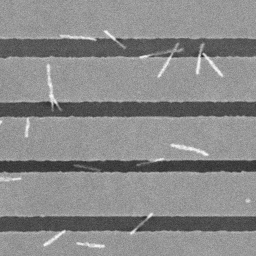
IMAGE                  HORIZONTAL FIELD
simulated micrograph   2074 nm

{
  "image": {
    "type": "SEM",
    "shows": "lines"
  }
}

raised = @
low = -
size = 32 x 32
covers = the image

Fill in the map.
@@@@@@@@@@@@@@@@@@@@@@@@@@@@@@@@
@@@@@@@@@@@@@@@@@@@@@@@@@@@@@@@@
@@@@@@@@@@@@@@@@@@@@@@@@@@@@@@@@
@@@@@@@@@@@@@@@@@@@@@@@@@@@@@@@@
@@@@@@@@@@@@@@@@@@@@@@@@@@@@@@@@
--------------------------------
--------------------------------
@@@@@@@@@@@@@@@@@@@@@@@@@@@@@@@@
@@@@@@@@@@@@@@@@@@@@@@@@@@@@@@@@
@@@@@@@@@@@@@@@@@@@@@@@@@@@@@@@@
@@@@@@@@@@@@@@@@@@@@@@@@@@@@@@@@
@@@@@@@@@@@@@@@@@@@@@@@@@@@@@@@@
@@@@@@@@@@@@@@@@@@@@@@@@@@@@@@@@
--------------------------------
--------------------------------
@@@@@@@@@@@@@@@@@@@@@@@@@@@@@@@@
@@@@@@@@@@@@@@@@@@@@@@@@@@@@@@@@
@@@@@@@@@@@@@@@@@@@@@@@@@@@@@@@@
@@@@@@@@@@@@@@@@@@@@@@@@@@@@@@@@
@@@@@@@@@@@@@@@@@@@@@@@@@@@@@@@@
--------------------------------
----------@----------------@--@-
@@@@@@@@@@@@@@@@@@@@@@@@@@@@@@@@
@@@@@@@@@@@@@@@@@@@@@@@@@@@@@@@@
@@@@@@@@@@@@@@@@@@@@@@@@@@@@@@@@
@@@@@@@@@@@@@@@@@@@@@@@@@@@@@@@@
@@@@@@@@@@@@@@@@@@@@@@@@@@@@@@@@
--------------------------------
--------------------------------
@@@@@@@@@@@@@@@@@@@@@@@@@@@@@@@@
@@@@@@@@@@@@@@@@@@@@@@@@@@@@@@@@
@@@@@@@@@@@@@@@@@@@@@@@@@@@@@@@@